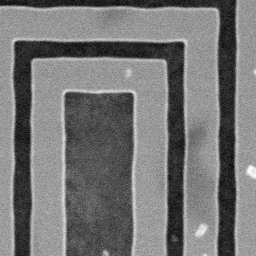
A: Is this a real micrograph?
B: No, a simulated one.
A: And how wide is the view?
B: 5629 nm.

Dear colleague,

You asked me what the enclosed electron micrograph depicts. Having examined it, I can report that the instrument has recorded groups of lines, slits or small figures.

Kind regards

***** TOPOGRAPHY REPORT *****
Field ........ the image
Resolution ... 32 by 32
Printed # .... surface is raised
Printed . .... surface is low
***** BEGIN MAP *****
..............................##
###########################...##
###########################...##
###########################...##
###########################...##
##.....................####...##
##.....................####...##
##..#############......####...##
##..#################..####...##
##..#################..####...##
##..#################..####...##
##..####...##...#####..####...##
##..####.........####..####...##
##..####.........####..####...##
##..####.........####..####...##
##..####.........####..####...##
##..####.........####..####...##
##..####.........####..####...##
##..####.........####..####...##
##..####.........####..####...##
##..####.........####..####...##
##..####.........####..####...##
##..####.........####..####...##
##..####.........####..####...##
##..####.........####..####...##
##..####.........####..####...##
##..####.........####..####...##
##..####.........####..####...##
##..####.........####..####...##
##..####.........####..####...##
##..####.........####..####...##
##..####.........####..####...##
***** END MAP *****